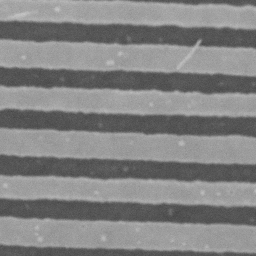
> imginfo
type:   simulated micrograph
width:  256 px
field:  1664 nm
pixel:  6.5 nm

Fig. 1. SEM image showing lines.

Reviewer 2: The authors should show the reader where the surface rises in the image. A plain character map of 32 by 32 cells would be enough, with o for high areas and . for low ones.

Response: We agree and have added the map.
ooooooooooooooooooooooo.........
oooooooooooooooooooooooooooooooo
oooooooooooooooooooooooooooooooo
...........................o.ooo
................................
ooooooooooooooo.................
oooooooooooooooooooooooooooooooo
oooooooooooooooooooooooooooooooo
...o.ooooooooooooooooooooooooooo
................................
................................
ooooooooooooooooooooo.o.........
oooooooooooooooooooooooooooooooo
oooooooooooooooooooooooooooooooo
............................oooo
................................
ooooooooooo.....................
oooooooooooooooooooooooooooooooo
oooooooooooooooooooooooooooooooo
..oooooooooooooooooooooooooooooo
................................
................................
oooooooooooooooooooo............
oooooooooooooooooooooooooooooooo
oooooooooooooooooooooooooooooooo
.......................ooooooooo
................................
ooooooo.........................
oooooooooooooooooooooooooooooooo
oooooooooooooooooooooooooooooooo
oooooooooooooooooooooooooooooooo
...........................o.ooo